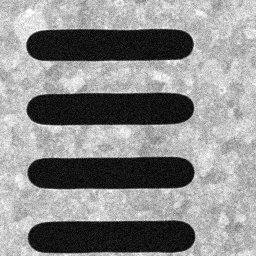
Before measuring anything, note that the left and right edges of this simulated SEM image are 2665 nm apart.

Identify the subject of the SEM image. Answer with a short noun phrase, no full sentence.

groups of lines, slits or small figures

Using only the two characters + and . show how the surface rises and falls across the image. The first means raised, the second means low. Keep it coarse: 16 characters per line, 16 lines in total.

++++++++++++++++
++++++++++++++++
++..........++++
++..........++++
++++++++++++++++
++++++++++++++++
++..........++++
++..........++++
++++++++++++++++
++++++++++++++++
++..........++++
++..........++++
++++++++++++++++
++++++++++++++++
++..........++++
++..........++++